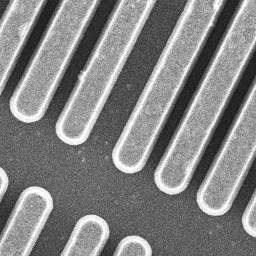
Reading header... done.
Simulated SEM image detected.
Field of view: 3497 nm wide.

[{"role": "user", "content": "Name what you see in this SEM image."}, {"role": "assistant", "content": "parallel lines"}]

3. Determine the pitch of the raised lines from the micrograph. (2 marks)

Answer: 714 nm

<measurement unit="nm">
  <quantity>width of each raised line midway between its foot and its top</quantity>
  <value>411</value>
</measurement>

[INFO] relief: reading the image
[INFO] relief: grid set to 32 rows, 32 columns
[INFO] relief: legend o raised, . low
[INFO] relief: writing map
.oooo...oooo...oooo.....oooo..oo
.oooo..ooooo..oooo.....oooo...oo
oooo...oooo...oooo.....oooo..ooo
oooo..ooooo..oooo.....oooo...ooo
ooo...oooo...oooo.....oooo..oooo
ooo..ooooo..oooo.....oooo...oooo
oo...oooo...oooo.....oooo..oooo.
oo..ooooo..oooo.....oooo...oooo.
o...oooo...oooo.....oooo..oooo..
o..ooooo..oooo.....oooo...oooo..
...oooo...oooo.....oooo..oooo...
..ooooo..oooo.....oooo...oooo..o
..oooo...oooo.....oooo..oooo...o
..oooo..oooo.....oooo...oooo..oo
..ooo...oooo.....oooo..oooo...oo
.......oooo.....oooo...oooo..ooo
.......oooo.....oooo..oooo...ooo
........oo.....oooo...oooo..oooo
...............oooo..oooo...oooo
..............oooo...oooo..ooooo
...............ooo..oooo...oooo.
....................oooo..ooooo.
o...................ooo...oooo..
o...................ooo..ooooo..
...ooo...................oooo...
..oooo...................oooo..o
..oooo....................o....o
.oooo.....oo...................o
.oooo.....ooo..................o
oooo.....oooo...................
oooo.....oooo..ooo..............
ooo.....oooo...oooo.............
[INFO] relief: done